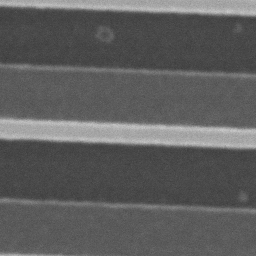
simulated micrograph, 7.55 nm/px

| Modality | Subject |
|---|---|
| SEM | lines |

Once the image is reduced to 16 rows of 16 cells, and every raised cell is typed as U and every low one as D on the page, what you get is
DDDDDUUUUUUUUUUU
DDDDDDDDDDDDDDDD
DDDDDDDDDDDDDDDD
DDDDDDDDDDDDDDDD
UUUUUUUUUUDDDDDD
UUUUUUUUUUUUUUUU
UUUUUUUUUUUUUUUU
UUUUUUUUUUUUUUUU
UUUUUUUUUUUUUUUU
DDDDDDDDDDDDDDDD
DDDDDDDDDDDDDDDD
DDDDDDDDDDDDDDDD
UDDDDDDDDDDDDDDD
UUUUUUUUUUUUUUUU
UUUUUUUUUUUUUUUU
UUUUUUUUUUUUUUUU